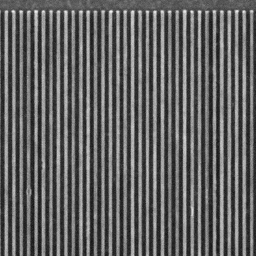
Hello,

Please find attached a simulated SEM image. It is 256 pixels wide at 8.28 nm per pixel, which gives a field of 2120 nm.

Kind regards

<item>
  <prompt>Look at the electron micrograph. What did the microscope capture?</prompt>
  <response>parallel lines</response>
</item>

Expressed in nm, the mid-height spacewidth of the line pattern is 42.4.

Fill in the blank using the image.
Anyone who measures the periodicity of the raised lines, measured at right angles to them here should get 61.5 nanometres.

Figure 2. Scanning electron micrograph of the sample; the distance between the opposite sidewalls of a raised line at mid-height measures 20.7 nm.